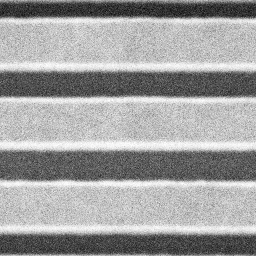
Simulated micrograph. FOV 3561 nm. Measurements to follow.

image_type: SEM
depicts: lines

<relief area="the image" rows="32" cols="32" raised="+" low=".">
................................
................................
++++++++++++++++++++++++++++++++
++++++++++++++++++++++++++++++++
++++++++++++++++++++++++++++++++
++++++++++++++++++++++++++++++++
++++++++++++++++++++++++++++++++
++++++++++++++++++++++++++++++++
...............................+
................................
................................
................................
++++++++++++++++++++++++++++++++
++++++++++++++++++++++++++++++++
++++++++++++++++++++++++++++++++
++++++++++++++++++++++++++++++++
++++++++++++++++++++++++++++++++
++++++++++++++++++++++++++++++++
................................
................................
................................
................................
................................
++++++++++++++++++++++++++++++++
++++++++++++++++++++++++++++++++
++++++++++++++++++++++++++++++++
++++++++++++++++++++++++++++++++
++++++++++++++++++++++++++++++++
++++++++++++++++++++++++++++++++
................................
................................
................................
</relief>